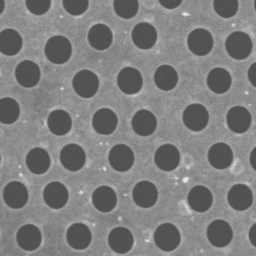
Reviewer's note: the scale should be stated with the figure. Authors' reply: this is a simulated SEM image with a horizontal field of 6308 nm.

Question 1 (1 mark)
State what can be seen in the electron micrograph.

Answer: a regular array of holes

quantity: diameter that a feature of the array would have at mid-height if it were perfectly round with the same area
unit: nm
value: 664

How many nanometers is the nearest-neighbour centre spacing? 990